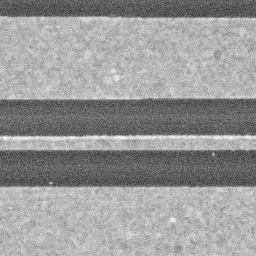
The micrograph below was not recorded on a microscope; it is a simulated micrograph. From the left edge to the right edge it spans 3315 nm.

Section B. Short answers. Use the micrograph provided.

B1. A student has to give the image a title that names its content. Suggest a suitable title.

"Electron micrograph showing lines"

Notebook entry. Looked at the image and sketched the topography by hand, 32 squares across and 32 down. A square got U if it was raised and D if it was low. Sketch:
DDDDDDDDDDDDDDDDDDDDDDDDDDDDDDDD
DDDDDDDDDDDDDDDDDDDDDDDDDDDDDDDD
UUUUUUUUUUUUUUUUUUUUUUUUUUUUUUUU
UUUUUUUUUUUUUUUUUUUUUUUUUUUUUUUU
UUUUUUUUUUUUUUUUUUUUUUUUUUUUUUUU
UUUUUUUUUUUUUUUUUUUUUUUUUUUUUUUU
UUUUUUUUUUUUUUUUUUUUUUUUUUUUUUUU
UUUUUUUUUUUUUUUUUUUUUUUUUUUUUUUU
UUUUUUUUUUUUUUUUUUUUUUUUUUUUUUUU
UUUUUUUUUUUUUUUUUUUUUUUUUUUUUUUU
UUUUUUUUUUUUUUUUUUUUUUUUUUUUUUUU
UUUUUUUUUUUUUUUUUUUUUUUUUUUUUUUU
DDDDDDDDDDDDDDDDDDDDDDDDDDDDDDDD
DDDDDDDDDDDDDDDDDDDDDDDDDDDDDDDD
DDDDDDDDDDDDDDDDDDDDDDDDDDDDDDDD
DDDDDDDDDDDDDDDDDDDDDDDDDDDDDDDD
DDDDDDDDDDDDDDDDDDDDDDDDDDDDDDDD
UUUUUUUUUUUUUUUUUUUUUUUUUUUUUUUU
UUUUUUUUUUUUUUUUUUUUUUUUUUUUUUUU
DDDDDDDDDDDDDDDDDDDDDDDDDDDDDDDD
DDDDDDDDDDDDDDDDDDDDDDDDDDDDDDDD
DDDDDDDDDDDDDDDDDDDDDDDDDDDDDDDD
DDDDDDDDDDDDDDDDDDDDDDDDDDDDDDDD
UUUUUUUUUUUUUUUUUUUUUUUUUUUUUUUU
UUUUUUUUUUUUUUUUUUUUUUUUUUUUUUUU
UUUUUUUUUUUUUUUUUUUUUUUUUUUUUUUU
UUUUUUUUUUUUUUUUUUUUUUUUUUUUUUUU
UUUUUUUUUUUUUUUUUUUUUUUUUUUUUUUU
UUUUUUUUUUUUUUUUUUUUUUUUUUUUUUUU
UUUUUUUUUUUUUUUUUUUUUUUUUUUUUUUU
UUUUUUUUUUUUUUUUUUUUUUUUUUUUUUUU
UUUUUUUUUUUUUUUUUUUUUUUUUUUUUUUU